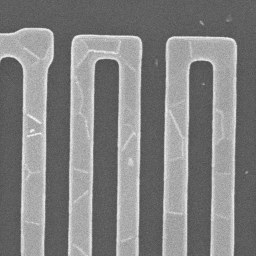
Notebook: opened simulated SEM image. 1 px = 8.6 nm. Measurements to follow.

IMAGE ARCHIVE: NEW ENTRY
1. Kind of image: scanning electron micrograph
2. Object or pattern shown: wiring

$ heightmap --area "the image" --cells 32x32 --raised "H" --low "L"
LLLLLLLLLLLLLLLLLLLLLLLLLLLLLLLL
LLLLLLLLLLLLLLLLLLLLLLLLLLLLLLLL
LLLLLLLLLLLLLLLLLLLLLLLLLLLLLLLL
LLLLLLLLLLLLLLLLLLLLLLLLLLLLLLLL
HHHHHHHLLLHHHHLLLLLLLLLLLLLLLLLL
HHHHHHHLLHHHHHHHHHLLLHHHHHHHHLLL
HHHHHHHLLHHHHHHHHHLLLHHHHHHHHLLL
LLHHHHHLLHHHLLHHHHLLLHHHHHHHHLLL
LLLHHHLLLHHHLLLHHHLLLHHHLLLHHLLL
LLLHHHLLLHHHLLLHHLLLLHHHLLLHHLLL
LLLHHHLLLHHHLLLHHLLLLHHLLLLHHLLL
LLLHHHLLLHHHLLLHHLLLLHHLLLLHHLLL
LLLHHHLLLHHHLLLHHLLLLHHLLLLHHLLL
LLLHHHLLLHHHLLLHHLLLLHHLLLLHHLLL
LLLHHHLLLHHHLLLHHLLLLHHLLLLHHLLL
LLLHHHLLLHHHLLLHHLLLLHHLLLLHHLLL
LLLHHHLLLHHHLLLHHLLLLHHLLLLHHLLL
LLLHHHLLLHHHLLLHHLLLLHHLLLLHHLLL
LLLHHHLLLHHHLLLHHLLLLHHLLLLHHLLL
LLLHHHLLLHHLLLLHHLLLLHHLLLLHHLLL
LLLHHHLLLHHLLLLHHLLLLHHLLLLHHLLL
LLLHHHLLLHHLLLLHHLLLLHHLLLLHHLLL
LLLHHHLLLHHLLLLHHLLLLHHLLLLHHLLL
LLLHHHLLLHHLLLLHHLLLLHHLLLLHHLLL
LLLHHHLLLHHLLLLHHLLLLHHLLLLHHLLL
LLLHHHLLLHHLLLLHHLLLLHHLLLLHHLLL
LLLHHHLLLHHLLLLHHLLLHHHLLLHHHLLL
LLLHHHLLLHHLLLLHHLLLHHHLLLHHHLLL
LLLHHHLLLHHLLLLHHLLLHHHLLLHHHLLL
LLLHHHLLLHHLLLLHHLLLHHHLLLHHHLLL
LLLHHLLLLHHLLLLHHLLLHHHLLLHHHLLL
LLLHHLLLLHHLLLLHHLLLHHHLLLHHHLLL